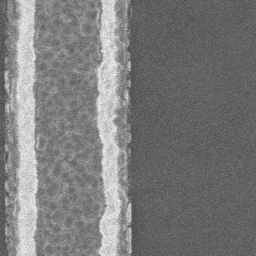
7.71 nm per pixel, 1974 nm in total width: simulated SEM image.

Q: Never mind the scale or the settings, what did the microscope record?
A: one or a few lines or trenches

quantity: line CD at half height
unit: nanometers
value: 658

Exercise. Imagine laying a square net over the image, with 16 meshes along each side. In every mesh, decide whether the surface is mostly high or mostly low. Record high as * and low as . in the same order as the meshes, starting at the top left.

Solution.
..*****.........
..*****.........
.******.........
.******.........
..*****.........
..*****.........
..*****.........
..*****.........
..*****.........
..*****.........
..*****.........
..*****.........
..*****.........
..*****.........
..*****.........
..*****.........